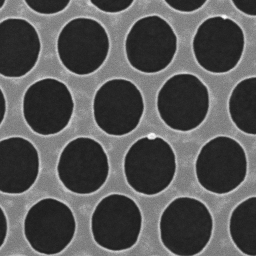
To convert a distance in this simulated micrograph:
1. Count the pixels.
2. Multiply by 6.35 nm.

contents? a regular array of holes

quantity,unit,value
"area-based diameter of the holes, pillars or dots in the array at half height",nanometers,342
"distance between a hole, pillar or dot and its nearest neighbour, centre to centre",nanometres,421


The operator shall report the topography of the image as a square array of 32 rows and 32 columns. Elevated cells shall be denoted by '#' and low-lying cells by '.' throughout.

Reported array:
###.....####....#####....####...
#####..######.################..
#..######...#####...######...###
....####.....###.....####.....##
.....##......###......##......##
.....##.......##......##.......#
.....##.......##......##......##
.....###.....###.....####.....##
....####....#####....####....###
#..###################..########
####....#####....####....#####..
###......###.....###......###...
.##......###......##......###...
.##......###......##......###...
###......###......##......###...
####....####.....####....####...
####...######...###############.
...######...#####...######...###
....####.....###.....####.....##
.....###.....###......###......#
.....##.......##......##.......#
.....##.......##......###......#
....####.....###.....####.....##
....####....#####....#####...###
##############..################
####....####.....####....#####..
####.....###......##......###...
.##......##.......##.......##...
.##......##.......##.......##...
.##......###.....###......###...
####.....###.....###......###...
#####..###############...#####..